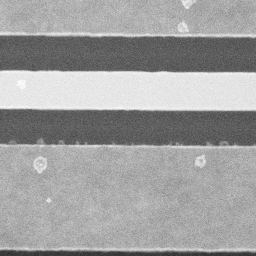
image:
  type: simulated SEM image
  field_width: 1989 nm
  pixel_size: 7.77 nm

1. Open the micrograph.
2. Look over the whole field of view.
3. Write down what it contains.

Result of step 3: lines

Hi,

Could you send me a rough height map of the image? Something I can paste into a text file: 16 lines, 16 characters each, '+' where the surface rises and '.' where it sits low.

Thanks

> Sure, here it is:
++++++++++++++++
++++++++++++++++
................
................
++++............
++++++++++++++++
++++++++++++++++
................
................
++++++++++++++++
++++++++++++++++
++++++++++++++++
++++++++++++++++
++++++++++++++++
++++++++++++++++
++++++++++++++++